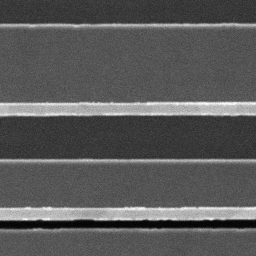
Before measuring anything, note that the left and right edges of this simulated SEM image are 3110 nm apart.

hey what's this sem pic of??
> lines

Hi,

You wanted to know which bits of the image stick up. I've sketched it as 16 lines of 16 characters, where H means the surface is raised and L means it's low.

LLLLLLLLLLLLLLLL
LLLLLLLLLLLLLLLL
HHHHHHHHHHHHHHHH
HHHHHHHHHHHHHHHH
HHHHHHHHHHHHHHHH
HHHHHHHHHHHHHHHH
HHHHHHHHHHHHHHHH
LLLLLLLLLLLLLLLL
LLLLLLLLLLLLLLLL
LLLLLLLLLLLLLLLL
HHHHHHHHHHHHHHHH
HHHHHHHHHHHHHHHH
HHHHHHHHHHHHHHHH
HHHHHHHHHHHHHHHH
HHHHHHHHHHHHHHHH
HHHHHHHHHHHHHHHH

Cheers